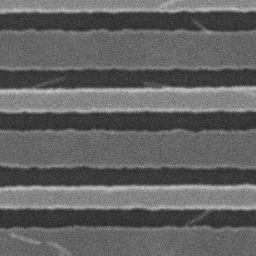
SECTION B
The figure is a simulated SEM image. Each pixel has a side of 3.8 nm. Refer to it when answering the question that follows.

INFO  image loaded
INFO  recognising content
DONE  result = lines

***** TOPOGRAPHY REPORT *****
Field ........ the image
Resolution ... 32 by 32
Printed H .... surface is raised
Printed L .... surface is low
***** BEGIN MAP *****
HHHHHHHHHHHHHHHHHHHHHHHHHHHHHHHH
HLLLLLLLLLLLLLLLLLLLLLLLLLLLLLLL
LLLLLLLLLLLLLLLLLLLLLLLLLLLLLLLL
LLLLLLLLLLLLLLLLLLLLLLLLLLLLLLLL
HHHHHHHHHHHHHHHHHHHHHHHHHHHHHHHH
HHHHHHHHHHHHHHHHHHHHHHHHHHHHHHHH
HHHHHHHHHHHHHHHHHHHHHHHHHHHHHHHH
HHHHHHHHHHHHHHHHHHHHHHHHHHHHHHHH
HHHHHHHHHHHHHHHHHHHHHHLHHHHHLHHH
LLLLLLLLLLLLLLLLLLLLLLLLLLLLLLLL
LLLLLLLLLLLLLLLLLLLLLLLLLLLLLLLL
HHHHHHHHHHHHHHHHHHHHHHHHHHHHHHHH
HHHHHHHHHHHHHHHHHHHHHHHHHHHHHHHH
HHHHHHHHHHHHHHHHHHHHHHHHHHHHHHHH
LLLLLLLLLLLLLLLLLLLLLLLLLLLLLLLL
LLLLLLLLLLLLLLLLLLLLLLLLLLLLLLLL
HHHHHHHHHHHHHHHHHHHLHHHHLHHHHHHH
HHHHHHHHHHHHHHHHHHHHHHHHHHHHHHHH
HHHHHHHHHHHHHHHHHHHHHHHHHHHHHHHH
HHHHHHHHHHHHHHHHHHHHHHHHHHHHHHHH
HHHHHHHHHHHHHHHHHHHHHHHHHHHHHHHH
LLLLLLLLLLLLLLLLLLLLLLLLLLLLLLLL
LLLLLLLLLLLLLLLLLLLLLLLLLLLLLLLL
HHHHHHHHHHHHHHHHHHHHHHHHHHHHHHHH
HHHHHHHHHHHHHHHHHHHHHHHHHHHHHHHH
HHHHHHHHHHHHHHHHHHHHHHHHHHHHHHHH
LLLLLLLLLLLLLLLLLLLLLLLLLLLLLLLL
LLLLLLLLLLLLLLLLLLLLLLLLLLLLLLLL
LLLLLLLLLHHLHHHLLLLLHHLHHHLLHLHL
HHHHHHHHHHHHHHHHHHHHHHHHHHHHHHHH
HHHHHHHHHHHHHHHHHHHHHHHHHHHHHHHH
HHHHHHHHHHHHHHHHHHHHHHHHHHHHHHHH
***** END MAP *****